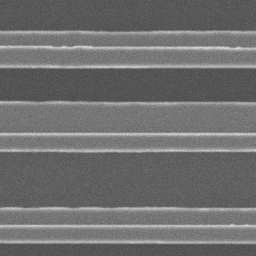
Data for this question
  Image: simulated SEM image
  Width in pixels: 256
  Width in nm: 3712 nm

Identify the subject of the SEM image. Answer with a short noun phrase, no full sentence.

lines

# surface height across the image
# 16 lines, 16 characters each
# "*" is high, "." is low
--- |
................
................
****************
****************
................
................
****************
****************
****************
................
................
................
................
****************
****************
................